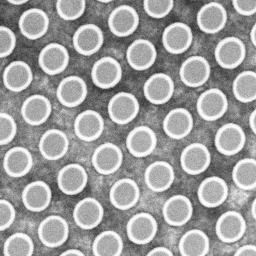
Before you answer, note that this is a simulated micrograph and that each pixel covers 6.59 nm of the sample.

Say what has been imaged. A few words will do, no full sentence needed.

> a regular array of raised bodies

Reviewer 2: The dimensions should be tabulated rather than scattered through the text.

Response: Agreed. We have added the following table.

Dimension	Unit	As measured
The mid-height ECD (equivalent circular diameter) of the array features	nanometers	182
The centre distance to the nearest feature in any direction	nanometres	252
